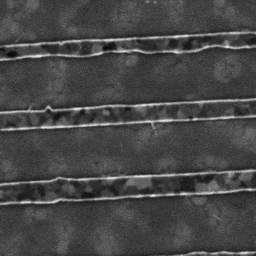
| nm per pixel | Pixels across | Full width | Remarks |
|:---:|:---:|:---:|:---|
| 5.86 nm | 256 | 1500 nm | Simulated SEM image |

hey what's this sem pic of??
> one or a few lines or trenches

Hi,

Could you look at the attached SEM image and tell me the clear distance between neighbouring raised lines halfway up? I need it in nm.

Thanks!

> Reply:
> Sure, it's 313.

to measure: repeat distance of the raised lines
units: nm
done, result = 413